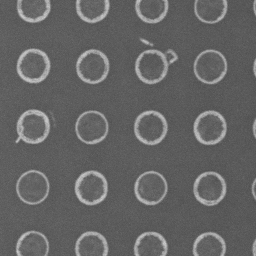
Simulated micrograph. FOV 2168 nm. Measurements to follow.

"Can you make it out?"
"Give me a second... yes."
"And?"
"a regular array of raised bodies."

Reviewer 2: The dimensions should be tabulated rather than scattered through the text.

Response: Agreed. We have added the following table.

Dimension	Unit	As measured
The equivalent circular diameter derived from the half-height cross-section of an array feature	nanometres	274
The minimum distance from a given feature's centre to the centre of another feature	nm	497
